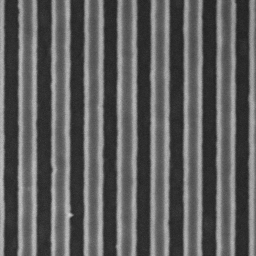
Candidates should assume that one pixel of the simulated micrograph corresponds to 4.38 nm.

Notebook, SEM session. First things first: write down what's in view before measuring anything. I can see parallel lines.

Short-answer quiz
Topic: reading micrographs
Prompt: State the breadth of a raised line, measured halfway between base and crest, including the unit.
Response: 62.4 nanometres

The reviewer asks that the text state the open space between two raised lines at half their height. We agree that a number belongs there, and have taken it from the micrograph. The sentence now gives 0.0788 µm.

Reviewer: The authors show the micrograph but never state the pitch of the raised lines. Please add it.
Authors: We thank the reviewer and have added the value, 0.145 um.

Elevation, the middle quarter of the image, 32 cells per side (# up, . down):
#.....###.....####....####.....#
#.....###.....####....####.....#
#.....###.....####....####.....#
#.....###.....####....####.....#
#.....###.....####....####.....#
#.....###.....####....####....##
#.....###.....####....####.....#
#.....###.....####....####.....#
#.....###.....###.....####.....#
#.....###.....####....####.....#
#.....###.....####....####....##
#.....###.....####....####....##
#.....###.....####....####....##
#.....###.....####....####....##
#.....###.....####....####.....#
#.....###.....####....####.....#
#.....###.....####....####.....#
#.....###.....####....####.....#
#.....###.....####....####.....#
#.....###.....####....####.....#
#.....###.....####....####.....#
#.....###.....####....####.....#
#.....###.....####....####.....#
#.....###.....####....####.....#
#.....###.....####....####.....#
#.....###.....####....####.....#
#.....###.....####....####.....#
#.....###.....####....####.....#
#.....###.....####....####.....#
#.....###.....####....####....##
#.....###.....####....####.....#
#.....###.....####....####.....#